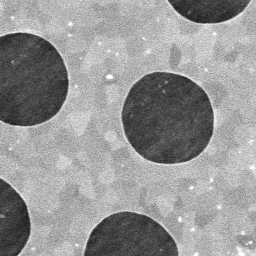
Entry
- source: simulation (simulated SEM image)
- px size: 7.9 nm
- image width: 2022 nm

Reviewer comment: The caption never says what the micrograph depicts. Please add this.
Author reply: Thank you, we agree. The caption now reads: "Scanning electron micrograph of holes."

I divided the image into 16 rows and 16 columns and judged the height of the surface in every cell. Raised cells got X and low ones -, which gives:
XXXXXXXXXXX----X
XXXXXXXXXXXXXXXX
---XXXXXXXXXXXXX
----XXXXXXXXXXXX
----XXXXXXXXXXXX
----XXXX-----XXX
----XXXX-----XXX
---XXXXX-----XXX
XXXXXXXX-----XXX
XXXXXXXXX----XXX
XXXXXXXXXXXXXXXX
-XXXXXXXXXXXXXXX
-XXXXXXXXXXXXXXX
--XXXXX--XXXXXXX
--XXXX----XXXXXX
-XXXX------XXXXX